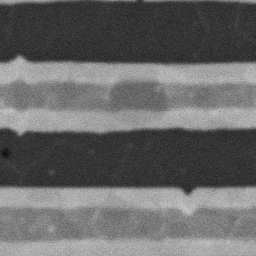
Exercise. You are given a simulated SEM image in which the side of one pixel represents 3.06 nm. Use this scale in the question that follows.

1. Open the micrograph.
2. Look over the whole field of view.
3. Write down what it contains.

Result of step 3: one or a few lines or trenches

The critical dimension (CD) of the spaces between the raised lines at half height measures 0.227 microns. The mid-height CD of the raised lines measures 168 nm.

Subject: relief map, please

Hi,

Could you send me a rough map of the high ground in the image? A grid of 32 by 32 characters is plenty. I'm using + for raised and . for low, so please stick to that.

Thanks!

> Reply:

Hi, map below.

................................
................................
................................
................................
................................
................................
................................
................................
..+.............................
++++++++++++++++++++++++++++++++
++++++++++++++++++++++++++++++++
++++++++++++++++++++++++++++++++
++++++++++++++++++++++++++++++++
++++++++++++++++++++++++++++++++
++++++++++++++++++++++++++++++++
................................
................................
................................
................................
................................
................................
................................
................................
................................
++++++++++..................++++
++++++++++++++++++++++++++++++++
++++++++++++++++++++++++++++++++
++++++++++++++++++++++++++++++++
++++++++++++++++++++++++++++++++
++++++++++++++++++++++++++++++++
++++++++++++++++++++++++++++++++
+++.............................